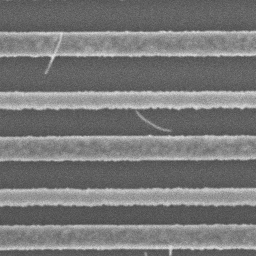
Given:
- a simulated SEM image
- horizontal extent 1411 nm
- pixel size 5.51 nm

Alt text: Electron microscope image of lines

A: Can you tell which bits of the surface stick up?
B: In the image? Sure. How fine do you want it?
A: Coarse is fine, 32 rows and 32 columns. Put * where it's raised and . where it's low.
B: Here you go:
................................
................................
................................
................................
********************************
********************************
********************************
................................
................................
................................
................................
..............*..**..*...**...**
********************************
*************.****.*.**.*.......
................................
................................
................................
********************************
********************************
********************************
................................
................................
................................
................................
********************************
********************************
................................
................................
********************************
********************************
********************************
................................